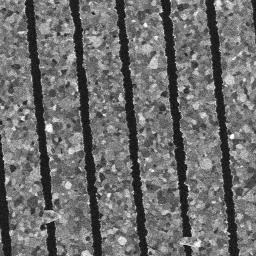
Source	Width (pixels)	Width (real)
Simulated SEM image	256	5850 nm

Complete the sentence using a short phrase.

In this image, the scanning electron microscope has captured parallel lines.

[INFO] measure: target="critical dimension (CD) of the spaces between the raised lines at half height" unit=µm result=0.216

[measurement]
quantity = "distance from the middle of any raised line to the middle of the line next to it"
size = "1030 nm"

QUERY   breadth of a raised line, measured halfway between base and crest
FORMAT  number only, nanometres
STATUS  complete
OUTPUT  819